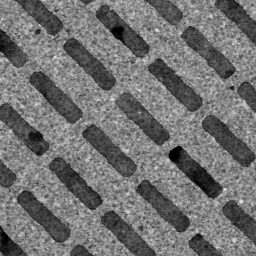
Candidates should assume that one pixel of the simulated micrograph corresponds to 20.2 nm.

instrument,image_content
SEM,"a regular array of holes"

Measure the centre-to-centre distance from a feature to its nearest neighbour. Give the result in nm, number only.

934